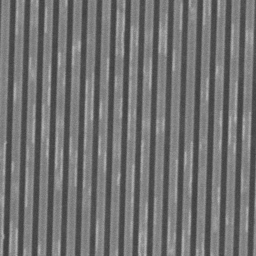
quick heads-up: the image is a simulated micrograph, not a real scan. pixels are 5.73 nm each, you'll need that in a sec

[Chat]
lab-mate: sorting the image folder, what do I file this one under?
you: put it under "parallel lines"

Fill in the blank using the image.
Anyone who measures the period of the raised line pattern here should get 82.3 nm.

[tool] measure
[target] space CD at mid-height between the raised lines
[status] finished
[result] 6.25 px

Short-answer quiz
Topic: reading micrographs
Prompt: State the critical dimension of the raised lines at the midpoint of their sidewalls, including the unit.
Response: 47.2 nm